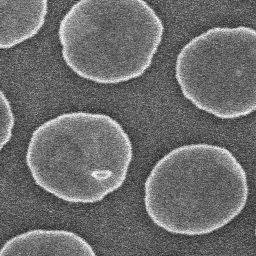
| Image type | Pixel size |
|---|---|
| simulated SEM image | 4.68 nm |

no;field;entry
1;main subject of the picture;raised bodies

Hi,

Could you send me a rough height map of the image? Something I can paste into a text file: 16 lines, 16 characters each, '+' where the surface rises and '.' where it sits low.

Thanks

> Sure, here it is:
+++..++++.......
+++.++++++......
+...++++++..++++
....++++++.+++++
.....++++..+++++
...........+++++
+...........++++
+..++++.........
+.++++++........
..++++++...+++..
..++++++..+++++.
..+++++..++++++.
....++...++++++.
.........++++++.
..++.......++...
++++++..........